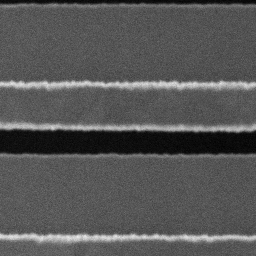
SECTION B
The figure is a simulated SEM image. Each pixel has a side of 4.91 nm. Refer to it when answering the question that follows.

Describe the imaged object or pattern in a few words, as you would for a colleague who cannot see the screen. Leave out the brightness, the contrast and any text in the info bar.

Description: lines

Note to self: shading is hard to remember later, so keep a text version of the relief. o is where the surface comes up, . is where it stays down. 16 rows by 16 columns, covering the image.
oooooooooooooooo
oooooooooooooooo
oooooooooooooooo
oooooooooooooooo
oooooooooooooooo
oooooooooooooooo
oooooooooooooooo
oooooooooooooooo
................
................
oooooooooooooooo
oooooooooooooooo
oooooooooooooooo
oooooooooooooooo
oooooooooooooooo
oooooooooooooooo